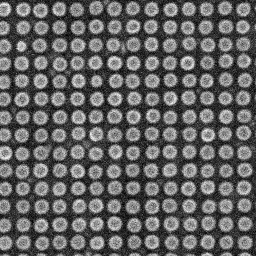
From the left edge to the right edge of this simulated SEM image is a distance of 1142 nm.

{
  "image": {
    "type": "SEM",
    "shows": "a regular array of raised bodies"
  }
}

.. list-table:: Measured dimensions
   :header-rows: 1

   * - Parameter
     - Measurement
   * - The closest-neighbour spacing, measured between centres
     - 17.4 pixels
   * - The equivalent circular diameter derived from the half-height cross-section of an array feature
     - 56.7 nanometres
